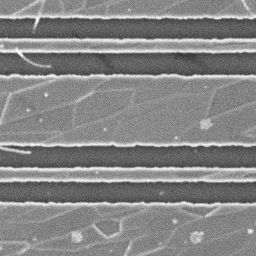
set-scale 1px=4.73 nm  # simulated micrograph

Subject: lines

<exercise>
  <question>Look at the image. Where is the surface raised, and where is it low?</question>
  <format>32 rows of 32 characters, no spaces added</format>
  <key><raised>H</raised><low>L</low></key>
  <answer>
HHHHHHHHHHHHHHHHHHHHHHHHHHHHHHHH
HHHHHHHHHHHHHHHHHHHHHHHHHHHHHHHH
LLLLLLLLLLLLLLLLLLLLLLLLLLLLLLLL
LLLLLLLLLLLLLLLLLLLLLLLLLLLLLLLL
LLLLLLLLLLLLLLLLLLLLLLLLLLLLLLLL
HHHHHHHHHHHHHHHHHHHHHHHHHHHHHHHH
HLHLLHHHHLLHHHHHHHLLHLLHLLHHLLLL
LLLLLLLLLLLLLLLLLLLLLLLLLLLLLLLL
LLLLLLLLLLLLLLLLLLLLLLLLLLLLLLLL
HHHHHHHHHHLHHHHHHHHHHHHLHHHHHHHH
HHHHHHHHHHHHHHHHHHHHHHHHHHHHHHHH
HHHHHHHHHHHHHHHHHHHHHHHHHHHHHHHH
HHHHHHHHHHHHHHHHHHHHHHHHHHHHHHHH
HHHHHHHHHHHHHHHHHHHHHHHHHHHHHHHH
HHHHHHHHHHHHHHHHHHHHHHHHHHHHHHHH
HHHHHHHHHHHHHHHHHHHHHHHHHHHHHHHH
HHHHHHHHHHHHHHHHHHHHHHHHHHHHHHHH
HHHHHHHHHHHHHHHHHHHHHHHHHHHHHHHH
LLLLLLLLLLLLLLLLLLLLLLLLLLLLLLLL
LLLLLLLLLLLLLLLLLLLLLLLLLLLLLLLL
LLLLLLLLLLLLLLLLLLLLLLLLLLLLLLLL
HHHHHHHHHHHHHHHHHHHHHHHHHHHHHHHH
HHHHHHHHHHHHHHHHHHHHHHHHHHHHHHHH
LLLLLLLLLLLLLLLLLLLLLLLLLLLLLLLL
LLLLLLLLLLLLLLLLLLLLLLLLLLLLLLLL
HHHHHHHLHHHHHHHHHHHHHHHHLLLHHHHH
HHHHHHHHHHHHHHHHHHHHHHHHHHHHHHHH
HHHHHHHHHHHHHHHHHHHHHHHHHHHHHHHH
HHHHHHHHHHHHHHHHHHHHHHHHHHHHHHHH
HHHHHHHHHHHHHHHHHHHHHHHHHHHHHHHH
HHHHHHHHHHHHHHHHHHHHHHHHHHHHHHHH
HHHHHHHHHHHHHHHHHHHHHHHHHHHHHHHH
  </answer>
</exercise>